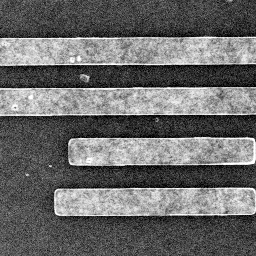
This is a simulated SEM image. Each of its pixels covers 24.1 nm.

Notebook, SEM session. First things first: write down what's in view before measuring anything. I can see groups of lines, slits or small figures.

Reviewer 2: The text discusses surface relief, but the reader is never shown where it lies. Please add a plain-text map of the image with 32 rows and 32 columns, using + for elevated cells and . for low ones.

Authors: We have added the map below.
................................
................................
................................
................................
................................
++++++++++++++++++++++++++++++++
++++++++++++++++++++++++++++++++
++++++++++++++++++++++++++++++++
................................
................................
................................
++++++++++++++++++++++++++++++++
++++++++++++++++++++++++++++++++
++++++++++++++++++++++++++++++++
................................
................................
................................
.........+++++++++++++++++++++++
.........+++++++++++++++++++++++
.........+++++++++++++++++++++++
.........+++++++++++++++++......
................................
................................
................................
.......+++++++++++++++++++++++++
.......+++++++++++++++++++++++++
.......+++++++++++++++++++++++++
................................
................................
................................
................................
................................